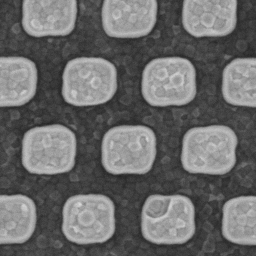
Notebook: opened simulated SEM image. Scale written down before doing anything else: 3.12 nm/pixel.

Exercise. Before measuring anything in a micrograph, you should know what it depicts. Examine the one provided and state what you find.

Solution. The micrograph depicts raised bodies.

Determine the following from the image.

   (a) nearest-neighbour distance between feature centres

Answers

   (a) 0.247 microns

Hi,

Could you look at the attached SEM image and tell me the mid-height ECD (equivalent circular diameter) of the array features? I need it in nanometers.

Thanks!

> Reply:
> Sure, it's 162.